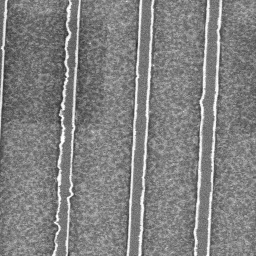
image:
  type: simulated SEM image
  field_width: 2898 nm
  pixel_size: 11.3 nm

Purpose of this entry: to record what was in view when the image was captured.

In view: one or a few lines or trenches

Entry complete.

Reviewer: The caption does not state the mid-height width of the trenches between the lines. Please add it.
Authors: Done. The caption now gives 688 nanometers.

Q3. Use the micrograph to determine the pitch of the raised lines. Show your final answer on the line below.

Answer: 792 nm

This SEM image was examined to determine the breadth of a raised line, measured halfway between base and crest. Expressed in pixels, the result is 12.5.